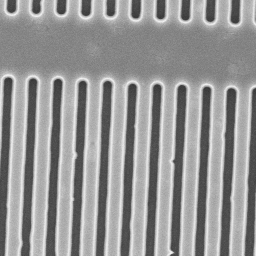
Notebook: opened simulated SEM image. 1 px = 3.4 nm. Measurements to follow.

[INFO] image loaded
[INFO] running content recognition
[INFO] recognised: parallel lines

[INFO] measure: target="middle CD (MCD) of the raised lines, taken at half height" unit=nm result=49.3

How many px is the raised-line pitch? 24.9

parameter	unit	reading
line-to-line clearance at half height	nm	37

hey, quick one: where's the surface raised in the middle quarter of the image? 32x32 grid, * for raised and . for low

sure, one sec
********************************
********************************
********************************
********************************
****..****..********************
***...***...****..****...***...*
***...***...****..****...***...*
***...***...****..****...***...*
***...***...****..****...***...*
***...***...****..****...***...*
***...***...****..****...***...*
***...***...****..****...***...*
***...***...***...****...***...*
***...***...***...****..****...*
***...***...***...***...****...*
***...***...***...***...****..**
***...***...***...***...****..**
***..****...***...***...***...**
***..****...***...***...***...**
***..****...***...***...***...**
***..****...***...***...****..**
***..****...***...***...***...**
***..****...***...***...***...**
***..****...***...***...***...**
**...****...***...***...***...**
**...****..****...***...***...**
**...***...****...***...***...**
**...***...****..****...***...**
**...***...****..****...***...**
**...***...****..****...***...**
**...***...****..****...***...**
**...***...****..****...***...**